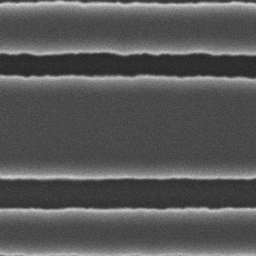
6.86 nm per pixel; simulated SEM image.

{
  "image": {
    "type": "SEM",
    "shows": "lines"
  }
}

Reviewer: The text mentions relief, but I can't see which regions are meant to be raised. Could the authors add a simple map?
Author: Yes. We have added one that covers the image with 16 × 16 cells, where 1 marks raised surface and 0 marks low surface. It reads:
1111111111111111
1111111111111111
1111111111111111
0000000000000000
0000000000000000
1111111111111111
1111111111111111
1111111111111111
1111111111111111
1111111111111111
1111111111111111
0000000000000000
0000000000000000
1111111111111111
1111111111111111
1111111111111111